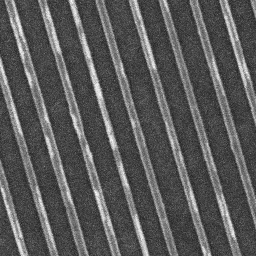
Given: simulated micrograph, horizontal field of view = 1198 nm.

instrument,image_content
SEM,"parallel lines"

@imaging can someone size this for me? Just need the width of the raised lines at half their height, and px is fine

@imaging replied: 6.73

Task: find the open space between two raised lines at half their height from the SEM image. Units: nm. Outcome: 103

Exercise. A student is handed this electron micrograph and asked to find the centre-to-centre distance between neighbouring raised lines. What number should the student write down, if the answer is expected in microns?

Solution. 0.137